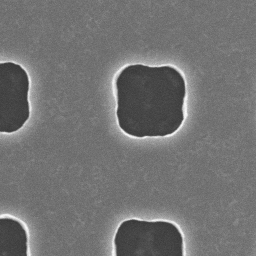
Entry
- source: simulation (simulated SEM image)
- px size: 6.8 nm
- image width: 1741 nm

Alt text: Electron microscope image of holes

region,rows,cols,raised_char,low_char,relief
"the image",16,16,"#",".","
################
################
################
################
..######...#####
..#####.....####
..#####....#####
..#####....#####
########..######
################
################
################
################
################
..#####....#####
..#####....#####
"